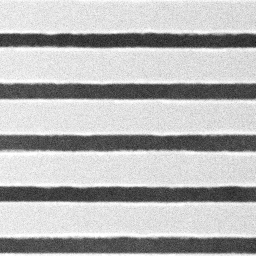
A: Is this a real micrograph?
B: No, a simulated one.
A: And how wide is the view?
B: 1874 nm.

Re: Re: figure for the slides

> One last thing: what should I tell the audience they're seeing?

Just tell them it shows lines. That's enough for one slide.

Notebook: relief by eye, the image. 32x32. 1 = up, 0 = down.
11111111111111111111111111111111
11111111111111111111111111111111
11111111111111111111111111111111
11111111111111111111111111111111
00000000000000000000000000000000
00000000000000000000000000000000
11111111111111111111111111111111
11111111111111111111111111111111
11111111111111111111111111111111
11111111111111111111111111111111
00000000000000000000000000000000
00000000000000000000000000000000
11111111111111000011100000000000
11111111111111111111111111111111
11111111111111111111111111111111
11111111111111111111111111111111
11111111111111111111111111111111
00000000000000000000000000000000
00000000000000000000000000000000
11111111111111111111111111111111
11111111111111111111111111111111
11111111111111111111111111111111
11111111111111111111111111111111
00000000000000000000000000000000
00000000000000000000000000000000
11111111111111111111111111111111
11111111111111111111111111111111
11111111111111111111111111111111
11111111111111111111111111111111
11111111111111111111111111111111
00000000000000000000000000000000
00000000000000000000000000000000